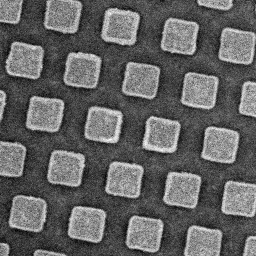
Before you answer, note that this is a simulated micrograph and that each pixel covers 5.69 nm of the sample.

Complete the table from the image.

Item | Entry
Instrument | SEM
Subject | a regular array of raised bodies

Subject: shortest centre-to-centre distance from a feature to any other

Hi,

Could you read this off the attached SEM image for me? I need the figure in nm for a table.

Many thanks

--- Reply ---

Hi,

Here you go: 327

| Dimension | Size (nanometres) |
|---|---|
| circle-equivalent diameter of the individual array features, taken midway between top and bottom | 206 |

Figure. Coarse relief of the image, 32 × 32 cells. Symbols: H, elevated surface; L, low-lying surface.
HHHLLLHHHHLLLLLLLLLLLLLLLHHHHLLL
HHLLLLHHHHLLLHHHLLLLLLLLLLLLLLLL
HHLLLLHHHHLLLHHHHLLLLHLLLLLLLLLL
LLLLLLHHHHLLLHHHHLLLLHHHHLLLLLLL
LLLLLLLLLLLLLHHHHLLLHHHHHLLLHHHH
LLHLLLLLLLLLLLLLLLLLHHHHLLLLHHHH
LHHHHLLLLLLLLLLLLLLLLLHHLLLLHHHH
LHHHHLLLHHHHLLLLLLLLLLLLLLLLHHHL
LHHHHLLLHHHHLLLLHHHHLLLLLLLLLLLL
LLLHHLLLHHHHLLLLHHHHLLLHHHLLLLLL
LLLLLLLLLHHHLLLLHHHHLLLHHHHLLLLH
LLLLLLLLLLLLLLLLHHHLLLLHHHHLLLHH
HLLLHHHLLLLLLLLLLLLLLLLHHHHLLLHH
LLLLHHHHLLLLLLLLLLLLLLLLLLLLLLHH
LLLHHHHHLLLHHHHLLLLLLLLLLLLLLLLH
LLLHHHHLLLLHHHHLLLHHHHLLLLLLLLLL
LLLLLLLLLLLHHHHLLLHHHHLLLLHHHLLL
LLLLLLLLLLLLHHHLLLHHHHLLLLHHHHLL
HHHLLLLLLLLLLLLLLLHHHHLLLHHHHHLL
HHHLLLLHHHLLLLLLLLLLLLLLLHHHHLLL
HHHLLLHHHHHLLLHHLLLLLLLLLLLLLLLL
HHHLLLHHHHLLLLHHHHLLLLLLLLLLLLLL
LLLLLLHHHHLLLLHHHHLLLHHHHLLLLLLL
LLLLLLLLLLLLLHHHHLLLLHHHHLLLHHHH
LLLLLLLLLLLLLLLHHLLLLHHHHLLLHHHH
LLHHHHLLLLLLLLLLLLLLLHHHLLLLHHHH
LHHHHHLLLHHHHLLLLLLLLLLLLLLLHHHH
LHHHHLLLLHHHHLLLHHHHLLLLLLLLLLLL
LLHHHLLLLHHHHLLLHHHHLLLLHLLLLLLL
LLLLLLLLLHHHHLLLHHHHLLLLHHHHLLLL
HLLLLLLLLLLLLLLLHHHHLLLHHHHHLLLH
HLLLLHHLLLLLLLLLLLLLLLLHHHHLLLLH